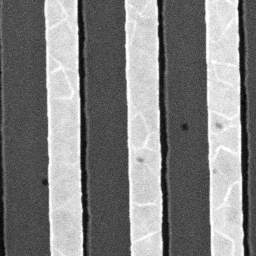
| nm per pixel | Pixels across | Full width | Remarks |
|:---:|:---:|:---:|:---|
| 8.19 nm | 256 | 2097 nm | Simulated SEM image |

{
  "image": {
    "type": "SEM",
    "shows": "lines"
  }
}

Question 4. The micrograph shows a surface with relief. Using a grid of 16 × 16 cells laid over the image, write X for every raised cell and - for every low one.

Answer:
---XX---XX---XX-
---XX---XX---XX-
---XX---XX---XX-
---XX---XX---XX-
---XX---XX---XX-
---XX---XX---XX-
---XX---XX---XX-
---XX---XX---XX-
---XX---XX---XX-
---XX---XX---XX-
---XX---XX---XX-
---XX---XX---XX-
---XX---XX---XX-
---XX---XX---XX-
---XX---XX---XX-
---XX---XX---XX-